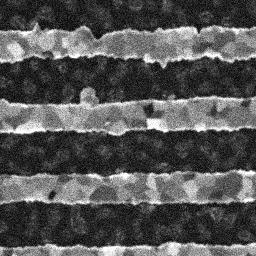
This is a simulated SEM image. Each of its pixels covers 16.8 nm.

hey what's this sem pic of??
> one or a few lines or trenches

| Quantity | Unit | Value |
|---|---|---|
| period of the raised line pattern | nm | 1200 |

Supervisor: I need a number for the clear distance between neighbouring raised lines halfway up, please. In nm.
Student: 731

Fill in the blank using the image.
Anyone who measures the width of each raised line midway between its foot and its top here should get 482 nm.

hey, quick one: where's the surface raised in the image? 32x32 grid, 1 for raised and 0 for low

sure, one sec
00000000000000000000000000000000
00000000000000000000000000000000
00000000000000000000000000000000
00001000001000000000000100111000
11111111111101111111111111111111
11111111111111111111111111111111
11111111111111111111111111111111
11100000000000000011100000001000
00000000000000000000000000000000
00000000000000000000000000000000
00000000000000000000000000000000
00000000001100000000000000000000
00000000001100000000010111111111
11111111111111111111111111111111
11111111111111111111111111111111
11111111111111111111111111111111
11110000000001110000000000000000
00000000000000000000000000000000
00000000000000000000000000000000
00000000000000000000000000000000
00000000000000000000100000000000
00000000000000000000000000000110
11111111111111111111111111111111
11111111111111111111111111111111
11111111111111111111111111111111
00000000000000000011000000000000
00000000000000000000000000110000
00000000000000000000000000000000
00000000000000000000000000000000
00000000000000000000000000000000
00000000000000000000010100000001
11111111111111111111111111111111